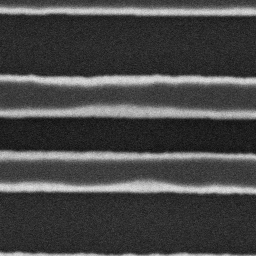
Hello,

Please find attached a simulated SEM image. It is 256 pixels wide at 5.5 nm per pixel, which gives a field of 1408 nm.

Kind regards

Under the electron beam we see lines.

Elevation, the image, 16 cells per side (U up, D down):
UUUUUUUUUUUUUUUU
DDDDDDDDDDDDDDDD
DDDDDDDDDDDDDDDD
DDDDDDDDDDDDDDDD
DDDDDDDDDDDDDDDD
UUUUUUUUUUUUUUUU
UUUUUUUUUUUUUUUU
DDDDDDDDDDDDDDDD
DDDDDDDDDDDDDDDD
DDDDDDDDDDDDDDDD
UUUUUUUUUUUUUUUU
UUUUUUUUUUUUUUUU
DDDDDDDDDDDDDDDD
DDDDDDDDDDDDDDDD
DDDDDDDDDDDDDDDD
DDDDDDDDDDDDDDDD